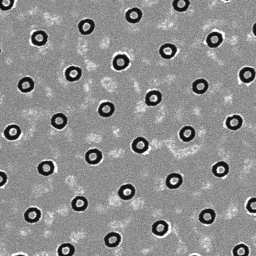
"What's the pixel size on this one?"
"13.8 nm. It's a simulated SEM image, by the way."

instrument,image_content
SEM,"a regular array of ring-shaped grooves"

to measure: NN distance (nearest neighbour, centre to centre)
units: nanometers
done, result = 668